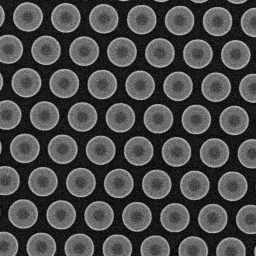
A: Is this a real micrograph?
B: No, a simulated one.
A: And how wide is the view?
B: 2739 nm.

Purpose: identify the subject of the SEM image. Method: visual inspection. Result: an array of small figures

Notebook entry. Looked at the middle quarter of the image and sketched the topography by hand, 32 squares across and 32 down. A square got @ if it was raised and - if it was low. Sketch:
-------------@@-------@@@@-----@
@-------------------------------
@@@----@@@@@-----@@@@------@@@@-
@@@@--@@@@@@@---@@@@@@----@@@@@-
@@@@--@@@@@@@---@@@@@@@--@@@@@@@
@@@@--@@@@@@@--@@@@@@@@--@@@@@@@
@@@---@@@@@@@---@@@@@@---@@@@@@@
@@@----@@@@@----@@@@@@---@@@@@@@
--------@@@------@@@@-----@@@@@-
--------------------------------
--@@@@@-----@@@@------@@@-------
-@@@@@@@---@@@@@@----@@@@@----@@
-@@@@@@@---@@@@@@@--@@@@@@@---@@
-@@@@@@@--@@@@@@@@--@@@@@@@---@@
-@@@@@@@---@@@@@@@--@@@@@@@---@@
--@@@@@@---@@@@@@----@@@@@@---@@
---@@@------@@@@-----@@@@@----@@
--------------------------------
@@-----@@@@------@@@-------@@---
@@@---@@@@@@----@@@@@----@@@@@@-
@@@---@@@@@@@--@@@@@@@---@@@@@@-
@@@---@@@@@@@--@@@@@@@---@@@@@@@
@@@---@@@@@@@--@@@@@@@---@@@@@@@
@@@---@@@@@@---@@@@@@@---@@@@@@-
@@-----@@@@-----@@@@@----@@@@@@-
---------------------------@@---
--@@@@-------@@-----------------
-@@@@@@----@@@@@-----@@@@@----@@
-@@@@@@@--@@@@@@@---@@@@@@----@@
-@@@@@@@--@@@@@@@---@@@@@@@--@@@
-@@@@@@@--@@@@@@@---@@@@@@@--@@@
-@@@@@@---@@@@@@@---@@@@@@@--@@@